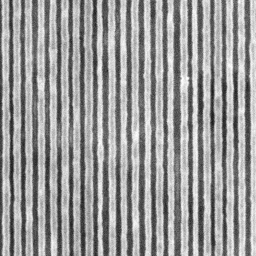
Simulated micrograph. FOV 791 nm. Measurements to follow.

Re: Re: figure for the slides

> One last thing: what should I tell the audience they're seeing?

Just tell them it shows parallel lines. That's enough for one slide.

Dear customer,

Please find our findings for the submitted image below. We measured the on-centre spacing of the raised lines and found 36.3 nm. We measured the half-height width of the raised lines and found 0.0185 µm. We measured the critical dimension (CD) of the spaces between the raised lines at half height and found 0.0185 micrometres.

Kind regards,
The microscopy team